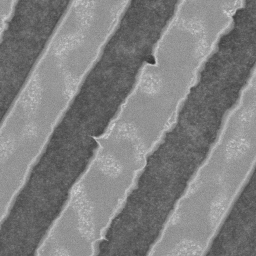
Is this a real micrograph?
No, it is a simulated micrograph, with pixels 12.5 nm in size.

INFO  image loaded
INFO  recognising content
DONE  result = one or a few lines or trenches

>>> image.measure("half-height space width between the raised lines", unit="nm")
572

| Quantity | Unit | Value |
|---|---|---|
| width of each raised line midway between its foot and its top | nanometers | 627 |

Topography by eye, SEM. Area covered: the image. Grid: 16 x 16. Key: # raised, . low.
#...####...####.
....###....###..
...####...####..
...###....###...
..####...###....
.####...####...#
.###....###....#
####...####...##
###...####....##
###...###....###
##...####...####
##...###....###.
#...####...####.
....###....###..
...####...####..
..####...####...